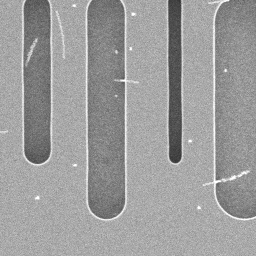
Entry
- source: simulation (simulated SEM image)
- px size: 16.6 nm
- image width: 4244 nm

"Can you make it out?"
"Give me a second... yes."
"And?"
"groups of lines, slits or small figures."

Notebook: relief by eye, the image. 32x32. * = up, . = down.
***...*****....******..*****....
***...*****.....*****..****.....
***...*****.....*****..****.....
***...*****.....*****..****.....
***...*****.....*****..****.....
***...*****.....*****..****.....
***...*****.....*****..****.....
***...*****.....*****..****.....
***...*****.....*****..****.....
***...*****.....*****..****.....
***...*****.....*****..****.....
***...*****.....*****..****.....
***...*****.....*****..****.....
***...*****.....*****..****.....
***...*****.....*****..****.....
***...*****.....*****..****.....
***...*****.....*****..****.....
***...*****.....*****..****.....
***...*****.....*****..****.....
***...*****.....*****..****.....
***********.....***********.....
***********.....***********.....
***********.....***********.....
***********.....***********.....
***********.....***********.....
***********.....***********.....
***********....*************....
********************************
********************************
********************************
********************************
********************************